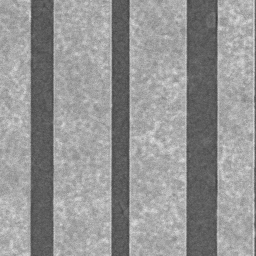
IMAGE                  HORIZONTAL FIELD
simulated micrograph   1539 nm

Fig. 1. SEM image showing one or a few lines or trenches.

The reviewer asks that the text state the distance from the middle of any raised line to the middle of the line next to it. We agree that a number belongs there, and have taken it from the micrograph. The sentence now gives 76.5 px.